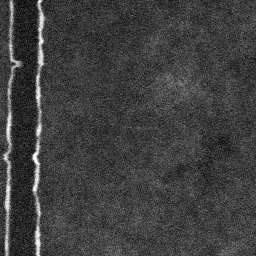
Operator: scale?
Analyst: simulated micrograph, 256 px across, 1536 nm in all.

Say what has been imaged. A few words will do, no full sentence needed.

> one or a few lines or trenches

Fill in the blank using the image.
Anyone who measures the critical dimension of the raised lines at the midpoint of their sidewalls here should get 185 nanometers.